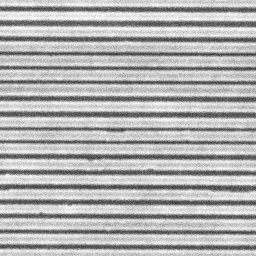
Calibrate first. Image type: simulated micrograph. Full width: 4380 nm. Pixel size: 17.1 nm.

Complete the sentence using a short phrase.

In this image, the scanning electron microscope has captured parallel lines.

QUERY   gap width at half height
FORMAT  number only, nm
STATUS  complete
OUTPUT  124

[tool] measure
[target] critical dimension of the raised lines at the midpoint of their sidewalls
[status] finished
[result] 141 nanometres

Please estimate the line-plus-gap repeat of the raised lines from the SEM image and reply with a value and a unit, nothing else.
254 nm